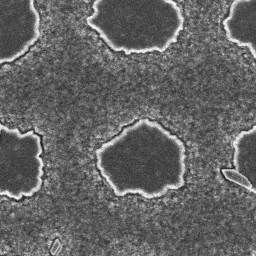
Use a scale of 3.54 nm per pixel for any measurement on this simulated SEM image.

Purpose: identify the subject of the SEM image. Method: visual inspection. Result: raised bodies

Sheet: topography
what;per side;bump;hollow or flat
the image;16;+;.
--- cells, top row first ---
++....+++++....+
++....+++++...++
++.....++++....+
+...............
................
................
................
................
+++....++++....+
+++...+++++....+
+++...+++++...++
++.....++++....+
................
................
................
................